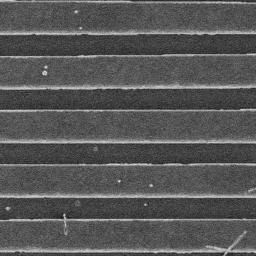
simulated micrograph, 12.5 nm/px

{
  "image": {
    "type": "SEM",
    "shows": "lines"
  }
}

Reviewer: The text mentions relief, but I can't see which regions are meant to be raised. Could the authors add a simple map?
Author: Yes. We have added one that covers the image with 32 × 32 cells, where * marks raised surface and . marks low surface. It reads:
********************************
********************************
********************************
********************************
................................
................................
................................
********************************
********************************
********************************
********************************
................................
................................
................................
********************************
********************************
********************************
********************************
................................
................................
................................
********************************
********************************
********************************
********************************
................................
................................
.*******************************
********************************
********************************
********************************
............................*...